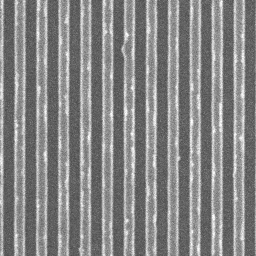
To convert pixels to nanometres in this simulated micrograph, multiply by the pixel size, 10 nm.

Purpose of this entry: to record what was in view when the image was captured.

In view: parallel lines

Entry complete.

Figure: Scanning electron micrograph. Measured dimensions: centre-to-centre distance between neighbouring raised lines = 0.22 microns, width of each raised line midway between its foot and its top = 90.1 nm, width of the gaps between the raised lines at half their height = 0.125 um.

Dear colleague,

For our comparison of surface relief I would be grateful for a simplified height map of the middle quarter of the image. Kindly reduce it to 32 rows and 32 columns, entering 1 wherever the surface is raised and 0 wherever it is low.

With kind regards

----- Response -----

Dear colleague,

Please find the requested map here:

10000110001100011000011000110000
10000110001100011000011000110000
10001110001100011000011000110000
10001110001100011100011000110000
10001110001100011100011000110000
10001110001100011100011000110000
10001110001100011100011000110000
10001110001100011100011000110000
10001110001100011100011000110000
10001110001100011000011000110000
10001110001100011000011000110000
10001110001100011000011000110000
10001110001100011000011000110000
10001110001100011000011000110000
10001110001100011000011000110000
10001110001100011000011000110000
10001110001100011000011000110000
10001110001100011000011000110000
10001110001100011000011000110000
10001100001100011000011000110000
10001110001100011000011000110000
10001110001100011000011000110000
10001110001100011000011000110000
10001110001100011000011000111000
10001110001100011000011000110000
10001110001100011000011000110000
10001110001100011000011000110000
10001110001100011000011000110000
10001110001100011000011000110000
10001110001100011000011000110000
10001110001100011000011000110000
10001110001100011000011000110000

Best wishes